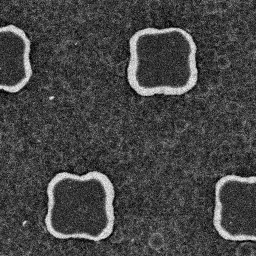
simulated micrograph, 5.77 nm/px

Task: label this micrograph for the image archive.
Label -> raised bodies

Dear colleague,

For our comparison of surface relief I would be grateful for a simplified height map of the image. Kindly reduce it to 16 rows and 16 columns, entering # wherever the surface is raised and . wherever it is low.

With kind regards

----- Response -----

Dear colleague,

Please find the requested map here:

................
................
##......####....
##......####....
##......####....
#........###....
................
................
................
................
................
...####.......##
...####.......##
...####.......##
...####.......##
................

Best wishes